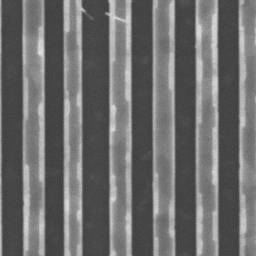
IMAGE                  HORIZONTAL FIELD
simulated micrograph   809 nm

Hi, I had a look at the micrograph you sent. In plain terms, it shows parallel lines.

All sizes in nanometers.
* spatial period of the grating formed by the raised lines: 137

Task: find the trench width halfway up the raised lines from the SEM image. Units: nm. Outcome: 71.9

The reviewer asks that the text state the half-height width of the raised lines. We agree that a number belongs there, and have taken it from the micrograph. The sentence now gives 0.0632 micrometres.